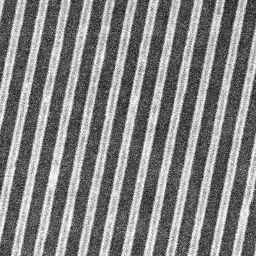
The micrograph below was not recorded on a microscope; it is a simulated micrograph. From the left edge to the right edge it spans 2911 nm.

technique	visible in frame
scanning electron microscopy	parallel lines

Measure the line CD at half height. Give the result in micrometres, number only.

0.0851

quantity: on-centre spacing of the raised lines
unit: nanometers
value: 246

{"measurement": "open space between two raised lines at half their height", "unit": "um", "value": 0.16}